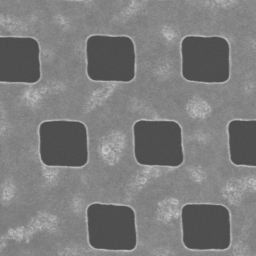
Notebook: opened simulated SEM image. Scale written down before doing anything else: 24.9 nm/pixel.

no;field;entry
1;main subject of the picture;holes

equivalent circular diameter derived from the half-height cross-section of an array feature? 1280 nanometres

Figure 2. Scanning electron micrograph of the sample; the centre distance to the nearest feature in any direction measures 2360 nanometers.